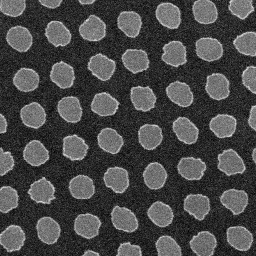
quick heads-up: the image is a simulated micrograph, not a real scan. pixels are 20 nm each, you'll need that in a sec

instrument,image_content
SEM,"a regular array of raised bodies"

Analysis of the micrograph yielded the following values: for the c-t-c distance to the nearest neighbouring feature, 736 nm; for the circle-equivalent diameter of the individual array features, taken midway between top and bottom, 0.485 microns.